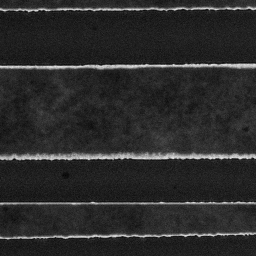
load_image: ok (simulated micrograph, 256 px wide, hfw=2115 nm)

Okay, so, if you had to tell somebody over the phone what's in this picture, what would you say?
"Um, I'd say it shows lines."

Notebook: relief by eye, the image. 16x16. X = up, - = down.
XXXXXXXXXXXXXXXX
----------------
----------------
----------------
XXXXXXXXXXXXXXXX
XXXXXXXXXXXXXXXX
XXXXXXXXXXXXXXXX
XXXXXXXXXXXXXXXX
XXXXXXXXXXXXXXXX
XXXXXXXXXXXXXXXX
----------------
----------------
----------------
XXXXXXXXXXXXXXXX
XXXXXXXXXXXXXXXX
----------------